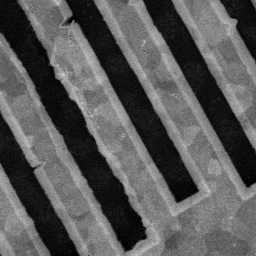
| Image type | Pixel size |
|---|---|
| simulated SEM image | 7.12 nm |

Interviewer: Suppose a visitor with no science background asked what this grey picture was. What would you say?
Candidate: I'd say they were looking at one or a few lines or trenches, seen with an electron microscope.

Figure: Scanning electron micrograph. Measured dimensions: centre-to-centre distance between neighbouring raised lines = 485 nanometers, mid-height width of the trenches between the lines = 257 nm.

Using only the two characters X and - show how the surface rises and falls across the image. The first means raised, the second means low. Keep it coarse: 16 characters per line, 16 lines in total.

--XX---XX--XXX--
--XX---XX---XX--
---XX---XX--XXX-
X--XXX--XX---XX-
XX--XX---XX---XX
XX--XXX--XXX--XX
XX---XX---XX---X
-XX--XXX--XXX--X
-XX---XX---XX---
--XX--XXX---XX--
--XXX--XX---XX--
---XX---XX---XX-
X--XXX--XXX-XXXX
X---XX---XXXXXXX
XX---XX---XXXXXX
XXX--XX--XXXXXXX